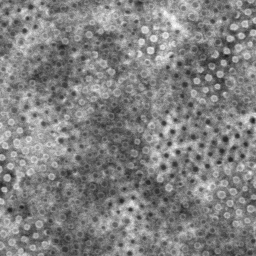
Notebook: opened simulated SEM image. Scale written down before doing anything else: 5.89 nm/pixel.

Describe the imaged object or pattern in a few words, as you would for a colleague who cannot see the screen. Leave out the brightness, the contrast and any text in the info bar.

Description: a regular array of raised bodies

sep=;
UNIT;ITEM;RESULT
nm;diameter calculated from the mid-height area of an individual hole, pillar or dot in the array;34.5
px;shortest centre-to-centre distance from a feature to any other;11.9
